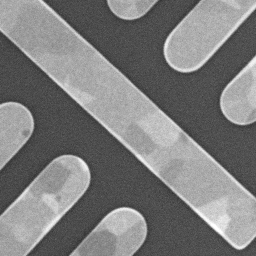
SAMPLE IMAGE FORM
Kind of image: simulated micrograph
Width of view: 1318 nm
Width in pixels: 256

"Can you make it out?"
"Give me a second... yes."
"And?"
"groups of lines, slits or small figures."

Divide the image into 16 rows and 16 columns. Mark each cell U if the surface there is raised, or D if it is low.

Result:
UUUDDDDUUDDDUUUU
UUUUDDDDDDDUUUUD
DUUUUDDDDDDUUUDD
DDUUUUDDDDUUUDDD
DDDUUUUDDDDDDDDU
DDDDUUUUUDDDDDUU
UDDDDUUUUUDDDDUU
UUDDDDUUUUUDDDUU
UUDDDDDUUUUUDDDD
UDDDDDDDUUUUUDDD
DDDUUDDDDUUUUUDD
DDUUUDDDDDUUUUUD
DUUUUDDDDDDUUUUU
UUUUDDDUUDDDDUUU
UUUDDDUUUDDDDDUU
UUDDDUUUUDDDDDDD